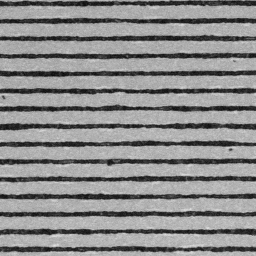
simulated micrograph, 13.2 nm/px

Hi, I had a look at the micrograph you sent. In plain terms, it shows parallel lines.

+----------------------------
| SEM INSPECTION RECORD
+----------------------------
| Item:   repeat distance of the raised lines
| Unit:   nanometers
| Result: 231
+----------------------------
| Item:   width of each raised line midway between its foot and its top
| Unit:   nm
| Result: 163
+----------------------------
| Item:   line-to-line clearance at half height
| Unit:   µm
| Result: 0.0674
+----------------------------